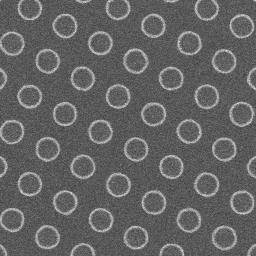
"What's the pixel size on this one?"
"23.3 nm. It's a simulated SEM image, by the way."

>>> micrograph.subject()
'a regular array of raised bodies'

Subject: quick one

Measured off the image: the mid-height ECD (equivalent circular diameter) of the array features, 521 nm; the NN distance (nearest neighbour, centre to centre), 912 nm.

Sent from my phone